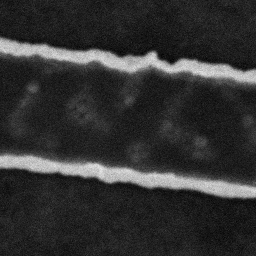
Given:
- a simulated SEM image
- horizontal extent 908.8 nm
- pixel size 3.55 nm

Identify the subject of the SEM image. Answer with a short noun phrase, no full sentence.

one or a few lines or trenches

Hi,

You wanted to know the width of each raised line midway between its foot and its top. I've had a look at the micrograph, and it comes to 409 nm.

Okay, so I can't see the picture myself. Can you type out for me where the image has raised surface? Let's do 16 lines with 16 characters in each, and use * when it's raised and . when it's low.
................
................
................
******..........
**************..
****************
****************
****************
****************
****************
....************
............****
................
................
................
................